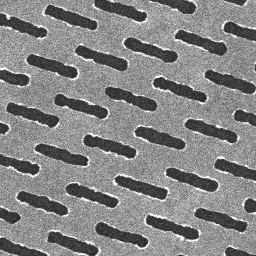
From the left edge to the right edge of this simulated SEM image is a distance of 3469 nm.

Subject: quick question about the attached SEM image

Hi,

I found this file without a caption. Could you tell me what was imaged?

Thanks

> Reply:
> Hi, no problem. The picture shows a regular array of holes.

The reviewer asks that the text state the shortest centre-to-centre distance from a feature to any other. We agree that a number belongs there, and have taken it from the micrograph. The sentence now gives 666 nanometers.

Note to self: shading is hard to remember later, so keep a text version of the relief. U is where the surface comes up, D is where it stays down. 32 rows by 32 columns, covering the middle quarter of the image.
DUUUUUUUUUUDDDDDUUUUUUUUUUUUUUUU
DDDUUUUUUUUUUDDUUUUUUUUUUUUUUUUU
DDDUUUUUUUUUUUUUUUUUUUUUUUUUUUUU
UDDUUUUUUUUUUUUUUUUUUUUDDUUUUUUU
UUUUUUUUUUUUUUUUUUUUUUDDDDDDUUUU
UUUUUUUUUUUUUUUUUUUUUUUDDDDDDDDU
UUUUUUUUUUDDDDDUUUUUUUUUUDDDDDDD
UUUUUUUUUUDDDDDDDUUUUUUUUUUUDDDD
DUUUUUUUUUUUDDDDDDDDDUUUUUUUUUUD
DDDDDDUUUUUUUUUUDDDDDDDUUUUUUUUU
DDDDDDDDDUUUUUUUUUDDDDDUUUUUUUUU
UUDDDDDDDDDUUUUUUUUUDDDUUUUUUUUU
UUUUUUDDDDDUUUUUUUUUUUUUUUUUUUUU
UUUUUUUUUDUUUUUUUUUUUUUUUUUUUUUU
UUUUUUUUUUUUUUUUUUUUUUUUUUUUUUUD
UUUUUUUUUUUUUUUUUUUUUUUUUUUUUUDD
UUUUUUUUUUUUUUUUUUDDDDDUUUUUUUUD
UUUUUUUUUUUUUUUUUUDDDDDDDDUUUUUU
UUUUUDDDDUUUUUUUUUUUDDDDDDDDDUUU
UUUUUDDDDDDDDDUUUUUUUDDDDDDDDDUU
UUUUUUDDDDDDDDDDUUUUUUUUUDDDDDUU
DUUUUUUUUUDDDDDDDDUUUUUUUUUUUUUU
DDUUUUUUUUUUUDDDDDUUUUUUUUUUUUUU
DDDDDDUUUUUUUUUUDUUUUUUUUUUUUUUU
DDDDDDUUUUUUUUUUUUUUUUUUUUUUUUUU
UUUUUUUUUUUUUUUUUUUUUUUUUUUUUUUU
UUUUUUUUUUUUUUUUUUUUUUUUUUDDDUUU
UUUUUUUUUUUUUUUUUUUUUUUUUDDDDDDD
UUUUUUUUUUUUUDDDDUUUUUUUUUUDDDDD
UUUUUUUUUUUUUDDDDDDDUUUUUUUUUDDD
UDDDDUUUUUUUUUDDDDDDDDDUUUUUUUUU
DDDDDDDUUUUUUUUUDDDDDDDDDDUUUUUU